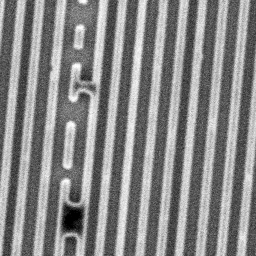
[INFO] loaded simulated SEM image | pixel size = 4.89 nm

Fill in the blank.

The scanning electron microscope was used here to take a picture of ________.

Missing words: parallel lines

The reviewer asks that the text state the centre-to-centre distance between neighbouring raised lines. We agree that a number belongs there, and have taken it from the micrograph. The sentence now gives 99.1 nm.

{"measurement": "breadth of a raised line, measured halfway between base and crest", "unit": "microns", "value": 0.0298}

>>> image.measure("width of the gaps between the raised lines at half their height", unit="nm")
71.3